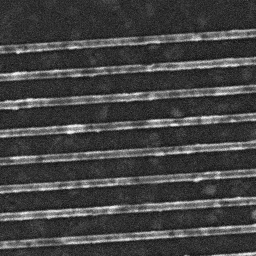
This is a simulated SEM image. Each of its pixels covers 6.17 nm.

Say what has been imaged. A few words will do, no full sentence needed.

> parallel lines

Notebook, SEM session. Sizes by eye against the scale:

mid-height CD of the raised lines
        6.73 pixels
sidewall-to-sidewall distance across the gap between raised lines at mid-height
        130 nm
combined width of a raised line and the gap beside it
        172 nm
